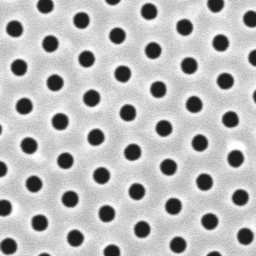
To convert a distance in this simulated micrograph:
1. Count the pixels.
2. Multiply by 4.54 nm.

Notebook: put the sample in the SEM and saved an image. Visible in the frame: a regular array of holes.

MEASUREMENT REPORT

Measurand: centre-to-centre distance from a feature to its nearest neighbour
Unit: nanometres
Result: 176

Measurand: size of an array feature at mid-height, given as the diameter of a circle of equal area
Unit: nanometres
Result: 77.6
